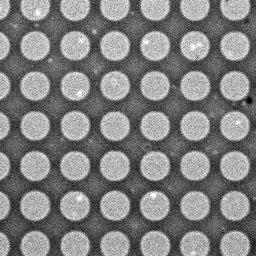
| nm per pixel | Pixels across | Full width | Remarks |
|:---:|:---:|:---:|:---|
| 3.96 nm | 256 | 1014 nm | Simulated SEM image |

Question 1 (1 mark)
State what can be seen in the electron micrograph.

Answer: an array of small figures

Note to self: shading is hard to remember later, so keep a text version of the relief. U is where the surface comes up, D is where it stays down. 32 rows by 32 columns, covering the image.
UDDUUUDDUUUDDUUUDDUUUDDUUUDDUUUD
UDDUUUDDUUUDDUUUDDUUUDDUUUDDUUUD
DDDDDDDDDDDDDDDDDDDDDDDDDDDDDDDD
DDDDDDDDDDDDDDDDDDDDDDDDDDDDDDDD
UDDUUUDDUUUDDUUUDDUUUDDUUUDDUUUD
UDDUUUDDUUUDDUUUDDUUUDDUUUDDUUUD
UDDUUUDDUUUDDUUUDDUUUDDUUUDDUUUD
DDDDDDDDDDDDDDDDDDDDDDDDDDDDDDDD
DDDDDDDDDDDDDDDDDDDDDDDDDDDDDDDD
UDDUUUDDUUUDDUUUDDUUUDDUUUDDUUUD
UDDUUUDDUUUDDUUUDDUUUDDUUUDDUUUD
UDDUUUDDUUUDDUUUDDUUUDDUUUDDUUUD
DDDDDDDDDDDDDDDDDDDDDDDDDDDDDDDD
DDDDDDDDDDDDDDDDDDDDDDDDDDDDDDDD
UDDUUUDDUUUDDUUUDDUUUDDUUUDDUUUD
UDDUUUDDUUUDDUUUDDUUUDDUUUDDUUUD
UDDUUUDDUUUDDUUUDDUUUDDUUUDDUUUD
DDDDDDDDDDDDDDDDDDDDDDDDDDDDDDDD
DDDDDDDDDDDDDDDDDDDDDDDDDDDDDDDD
UDDUUUDDUUUDDUUUDDUUUDDUUUDDUUUD
UDDUUUDDUUUDDUUUDDUUUDDUUUDDUUUD
UDDUUUDDUUUDDUUUDDUUUDDUUUDDUUUD
DDDDDDDDDDDDDDDDDDDDDDDDDDDDDDDD
DDDDDDDDDDDDDDDDDDDDDDDDDDDDDDDD
UDDUUUDDUUUDDUUUDDUUUDDUUUDDUUUD
UDDUUUDDUUUDDUUUDDUUUDDUUUDDUUUD
UDDUUUDDUUUDDUUUDDUUUDDUUUDDUUUD
DDDDDDDDDDDDDDDDDDDDDDDDDDDDDDDD
DDDDDDDDDDDDDDDDDDDDDDDDDDDDDDDD
UDDUUUDDUUUDDUUUDDUUUDDUUUDDUUUD
UDDUUUDDUUUDDUUUDDUUUDDUUUDDUUUD
UDDUUUDDUUUDDUUUDDUUUDDUUUDDUUUD